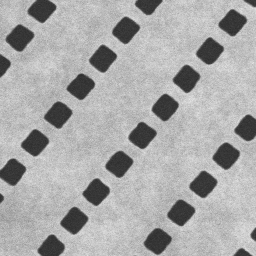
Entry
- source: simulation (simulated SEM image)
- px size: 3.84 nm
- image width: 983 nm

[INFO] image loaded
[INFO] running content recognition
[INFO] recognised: a regular array of holes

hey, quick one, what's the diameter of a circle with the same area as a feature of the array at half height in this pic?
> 0.0919 µm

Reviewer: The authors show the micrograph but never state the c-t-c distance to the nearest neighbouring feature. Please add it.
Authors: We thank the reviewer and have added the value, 139 nm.